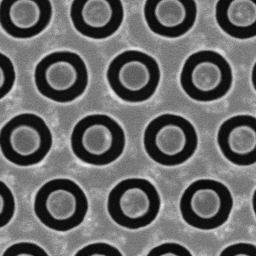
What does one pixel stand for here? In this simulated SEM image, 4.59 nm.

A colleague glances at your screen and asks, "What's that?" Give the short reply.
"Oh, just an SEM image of a regular array of ring-shaped grooves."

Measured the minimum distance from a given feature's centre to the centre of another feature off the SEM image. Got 333 nanometers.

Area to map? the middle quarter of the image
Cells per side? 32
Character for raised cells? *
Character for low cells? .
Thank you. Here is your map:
**...******....*****....******..
***...*****...*******...******..
***...*****...*******...*****...
***...*****...*******...*****...
***...*****...*******...*****...
**....*****....*****...******...
.....*******...........*******..
.....********.........*********.
...***********.......***********
.***************...*************
********************************
********************************
*************************..*****
*****.......***********.......**
****.........*********.........*
***....**.....*******.....**....
**....*****....*****....*****...
**...*******...*****...*******..
**...*******...*****...*******..
**...*******...*****...*******..
**...******....*****...*******..
**....*****....*****....*****...
***.....*.....*******.....**....
***..........*********..........
*****.......***********.......**
********.****************...****
********************************
********************************
********************************
..************........**********
....*********..........********.
.....*******....***....*******..